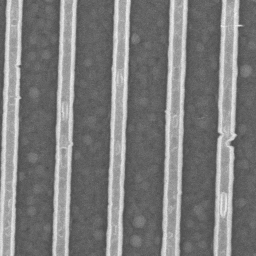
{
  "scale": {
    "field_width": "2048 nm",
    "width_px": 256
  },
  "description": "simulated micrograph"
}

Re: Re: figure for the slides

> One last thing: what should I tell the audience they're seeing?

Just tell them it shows parallel lines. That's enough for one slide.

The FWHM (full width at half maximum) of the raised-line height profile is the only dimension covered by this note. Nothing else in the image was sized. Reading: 103 nm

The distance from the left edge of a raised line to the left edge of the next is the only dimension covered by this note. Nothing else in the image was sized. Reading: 431 nm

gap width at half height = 329 nanometres